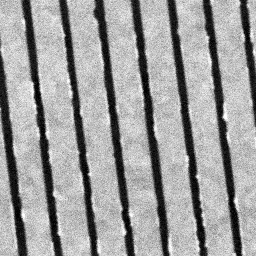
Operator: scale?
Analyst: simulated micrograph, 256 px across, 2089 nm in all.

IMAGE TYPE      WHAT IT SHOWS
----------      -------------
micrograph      parallel lines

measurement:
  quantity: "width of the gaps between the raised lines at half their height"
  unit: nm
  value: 70.9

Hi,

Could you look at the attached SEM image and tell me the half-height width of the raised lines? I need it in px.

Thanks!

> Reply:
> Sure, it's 26.9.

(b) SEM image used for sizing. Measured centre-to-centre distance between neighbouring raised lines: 292 nm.